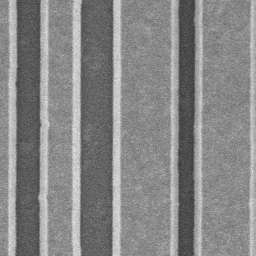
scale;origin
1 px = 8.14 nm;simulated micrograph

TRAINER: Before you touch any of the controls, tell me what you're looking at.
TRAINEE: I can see one or a few lines or trenches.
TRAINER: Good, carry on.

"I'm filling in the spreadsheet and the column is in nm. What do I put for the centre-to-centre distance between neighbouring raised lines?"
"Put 676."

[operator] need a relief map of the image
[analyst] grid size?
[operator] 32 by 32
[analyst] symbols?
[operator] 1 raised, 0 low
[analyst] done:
11000011110000011111110001111111
11000011110000011111110001111111
11000011110000011111110001111111
11000011110000011111110001111111
11000011110000011111110001111111
11000011110000011111110001111111
11000011110000011111110001111111
11000011110000011111110001111111
11000011110000011111110001111111
11000011110000011111110001111111
11000111110000011111110001111111
11000111110000011111110001111111
11000111110000011111110001111111
11000011110000011111110001111111
11000011110000011111110001111111
11000011110000011111110001111111
11000111110000011111110001111111
10000011100000011111110001111111
10000111100000011111110001111111
10000111100000011111110001111111
10000111100000011111110001111111
10000111100000011111110001111111
10000111100000011111110001111111
10000111100000011111110001111111
10000111100000011111110001111111
10000111100000011111110001111111
10000011100000011111110001111111
10000011100000011111110001111111
10000011100000011111110001111111
10000111100000011111110001111111
10000011110000011111110001111111
10000011110000011111110001111111